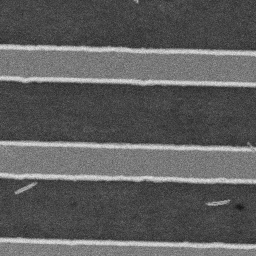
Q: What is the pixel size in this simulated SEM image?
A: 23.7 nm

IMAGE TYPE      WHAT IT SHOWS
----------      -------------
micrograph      one or a few lines or trenches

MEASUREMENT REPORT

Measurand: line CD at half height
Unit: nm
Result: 748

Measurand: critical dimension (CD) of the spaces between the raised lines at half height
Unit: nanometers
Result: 1540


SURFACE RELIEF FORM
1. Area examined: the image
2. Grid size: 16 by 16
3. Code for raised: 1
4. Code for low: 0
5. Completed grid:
0000000000000000
0000000000000000
0000000000000000
1111111111111111
1111111111111111
0000000000000000
0000000000000000
0000000000000000
0000000000000000
1111111111111111
1111111111111111
0000000000000000
0000000000000000
0000000000000000
0000000000000000
1111111111111111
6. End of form